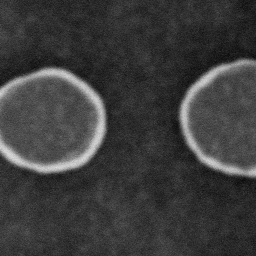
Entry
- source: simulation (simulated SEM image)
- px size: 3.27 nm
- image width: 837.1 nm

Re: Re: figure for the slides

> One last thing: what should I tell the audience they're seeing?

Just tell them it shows raised bodies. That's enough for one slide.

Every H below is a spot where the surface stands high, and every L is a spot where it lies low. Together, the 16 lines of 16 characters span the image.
LLLLLLLLLLLLLLLL
LLLLLLLLLLLLLLLL
LLLLLLLLLLLLLLLL
LLLLLLLLLLLLLLLL
LLLHLLLLLLLLLHHH
HHHHHLLLLLLLHHHH
HHHHHHLLLLLLHHHH
HHHHHHLLLLLHHHHH
HHHHHHLLLLLLHHHH
HHHHHHLLLLLLHHHH
LLHHLLLLLLLLLLHH
LLLLLLLLLLLLLLLL
LLLLLLLLLLLLLLLL
LLLLLLLLLLLLLLLL
LLLLLLLLLLLLLLLL
LLLLLLLLLLLLLLLL